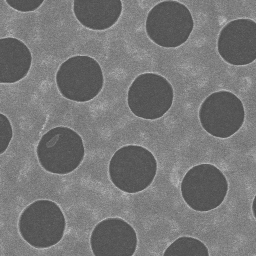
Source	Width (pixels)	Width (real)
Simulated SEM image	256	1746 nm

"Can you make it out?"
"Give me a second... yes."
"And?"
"holes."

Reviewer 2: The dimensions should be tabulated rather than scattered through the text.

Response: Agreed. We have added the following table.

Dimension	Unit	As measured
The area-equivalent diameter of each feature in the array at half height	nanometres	318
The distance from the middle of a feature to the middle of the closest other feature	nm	504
